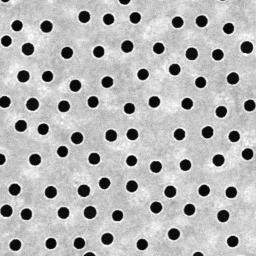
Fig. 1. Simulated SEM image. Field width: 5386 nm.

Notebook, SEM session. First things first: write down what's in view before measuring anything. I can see a regular array of holes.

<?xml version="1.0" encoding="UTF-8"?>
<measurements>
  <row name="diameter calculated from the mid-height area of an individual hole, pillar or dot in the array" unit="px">12.4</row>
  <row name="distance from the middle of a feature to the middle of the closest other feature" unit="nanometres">518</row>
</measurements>